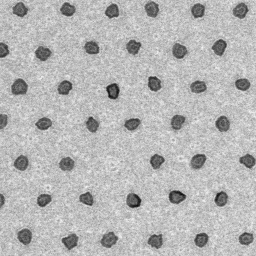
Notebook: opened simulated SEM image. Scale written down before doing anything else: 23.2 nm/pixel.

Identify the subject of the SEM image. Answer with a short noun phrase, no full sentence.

a regular array of ring-shaped grooves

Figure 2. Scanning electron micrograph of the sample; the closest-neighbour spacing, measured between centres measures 953 nanometres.